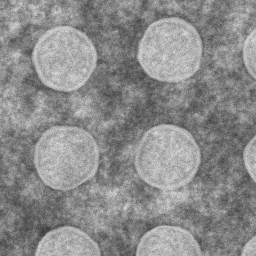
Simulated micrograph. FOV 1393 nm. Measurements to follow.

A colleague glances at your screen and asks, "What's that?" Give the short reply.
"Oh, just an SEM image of raised bodies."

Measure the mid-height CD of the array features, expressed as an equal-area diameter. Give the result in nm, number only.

344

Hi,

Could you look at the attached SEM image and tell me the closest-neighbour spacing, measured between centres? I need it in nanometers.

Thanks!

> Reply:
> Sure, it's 544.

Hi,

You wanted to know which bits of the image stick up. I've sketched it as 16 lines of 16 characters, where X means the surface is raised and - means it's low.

----------------
----------XX----
---XXX---XXX---X
--XXXX---XXXX--X
--XXXX---XXX----
---XX-----------
----------------
----------------
---XXX---XXX----
--XXXX---XXX---X
--XXXX---XXX---X
---XX----XX-----
----------------
----------------
---XX----XXX----
--XXXX---XXX---X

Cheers